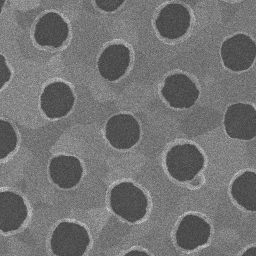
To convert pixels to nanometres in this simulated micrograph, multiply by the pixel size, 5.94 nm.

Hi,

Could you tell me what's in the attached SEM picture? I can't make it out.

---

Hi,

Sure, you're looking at a regular array of holes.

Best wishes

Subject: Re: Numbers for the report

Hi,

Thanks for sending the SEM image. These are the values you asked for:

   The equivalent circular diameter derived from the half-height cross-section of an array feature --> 217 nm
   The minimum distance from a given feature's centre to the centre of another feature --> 411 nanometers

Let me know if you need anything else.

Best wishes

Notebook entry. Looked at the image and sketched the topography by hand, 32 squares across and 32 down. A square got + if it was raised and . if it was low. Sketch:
.+++++++++++...++++++.++++++++++
++++++.+++++++++++++....++++++++
+++++...+++++++++++.....++++++++
++++.....+++++++++++....++++++++
++++.....+++++++++++...++++++..+
+++++...++++++.+++++++++++++....
+++++++++++++...++++++++++++....
.+++++++++++....++++++++++++....
.+++++++++++....++++++++++++...+
.++++++++++++..++++++...++++++++
.+++++..++++++++++++.....+++++++
+++++....+++++++++++.....+++++++
+++++....++++++++++++....+++++++
+++++....+++++++++++++..+++++...
++++++..++++++...+++++++++++....
.++++++++++++....+++++++++++....
..+++++++++++.....++++++++++....
..+++++++++++.....++++++++++++.+
..++++++++++++..+++++....+++++++
.++++++..++++++++++++....+++++++
++++++....+++++++++++....+++++++
++++++....+++++++++++....++++++.
++++++....++++++++++++..+++++...
++++++++.+++++...++++++++++++...
...+++++++++++....+++++++++++...
...+++++++++++....++++++++++++..
...+++++++++++....++++++++++++++
...+++++++++++++.++++++...++++++
..+++++....+++++++++++....++++++
++++++.....+++++++++++....++++++
++++++.....+++++++++++...+++++++
+++++++....+++++..+++++++++++++.